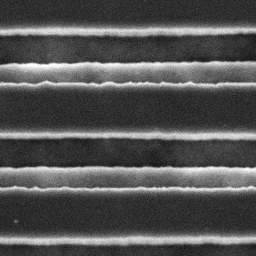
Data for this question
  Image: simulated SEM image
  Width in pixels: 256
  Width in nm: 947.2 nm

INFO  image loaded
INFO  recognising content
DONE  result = lines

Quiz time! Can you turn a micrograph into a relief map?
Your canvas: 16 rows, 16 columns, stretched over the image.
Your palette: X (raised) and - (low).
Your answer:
XXXXXXXXXXXXXXXX
XXXXXXXXXXXXXXXX
----------------
----------------
XXXXXXXXXXXXXXXX
XXXXXXXXXXXXXXXX
XXXXXXXXXXXXXXXX
XXXXXXXXXXXXXXXX
----------------
----------------
-XXXXXXXXXX-XXX-
XXXXXXXXXXXXXXXX
XXXXXXXXXXXXXXXX
XXXXXXXXXXXXXXXX
XXXXXXXXXXXXXXXX
----------------